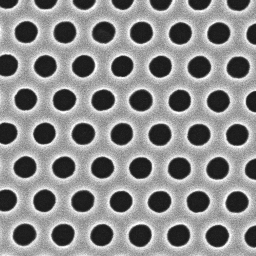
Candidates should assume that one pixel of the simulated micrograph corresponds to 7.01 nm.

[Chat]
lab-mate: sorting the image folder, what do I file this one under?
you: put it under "a regular array of holes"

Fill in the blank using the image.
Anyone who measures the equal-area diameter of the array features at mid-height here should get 0.152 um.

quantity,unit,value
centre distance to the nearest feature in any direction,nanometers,269